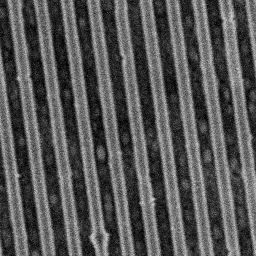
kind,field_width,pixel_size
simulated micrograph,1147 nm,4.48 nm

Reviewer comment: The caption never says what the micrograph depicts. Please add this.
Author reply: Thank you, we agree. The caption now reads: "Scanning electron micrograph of parallel lines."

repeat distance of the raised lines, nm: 117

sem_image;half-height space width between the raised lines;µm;0.0682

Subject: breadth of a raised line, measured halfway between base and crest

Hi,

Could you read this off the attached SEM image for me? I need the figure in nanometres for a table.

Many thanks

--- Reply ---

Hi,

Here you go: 48.3